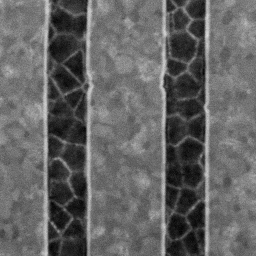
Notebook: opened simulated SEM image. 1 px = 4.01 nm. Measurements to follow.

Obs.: one or a few lines or trenches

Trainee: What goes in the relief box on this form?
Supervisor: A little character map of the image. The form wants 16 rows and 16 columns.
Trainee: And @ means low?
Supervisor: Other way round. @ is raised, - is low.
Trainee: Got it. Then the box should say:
@@@---@@@@---@@@
@@@---@@@@---@@@
@@@---@@@@---@@@
@@@--@@@@@---@@@
@@@---@@@@---@@@
@@@---@@@@---@@@
@@@---@@@@---@@@
@@@---@@@@---@@@
@@@--@@@@@---@@@
@@@---@@@@---@@@
@@@---@@@@---@@@
@@@---@@@@---@@@
@@@---@@@@---@@@
@@@---@@@@---@@@
@@@---@@@@---@@@
@@@--@@@@@---@@@